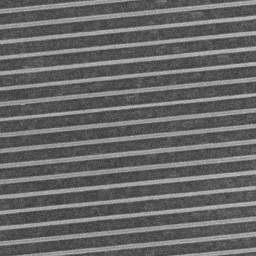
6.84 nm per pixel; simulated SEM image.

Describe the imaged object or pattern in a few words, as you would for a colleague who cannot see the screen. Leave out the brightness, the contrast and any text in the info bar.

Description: parallel lines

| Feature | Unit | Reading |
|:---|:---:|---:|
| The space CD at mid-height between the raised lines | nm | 80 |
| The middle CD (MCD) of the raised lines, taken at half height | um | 0.0264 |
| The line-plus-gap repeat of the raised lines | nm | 105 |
